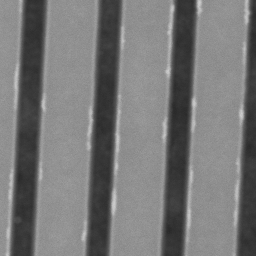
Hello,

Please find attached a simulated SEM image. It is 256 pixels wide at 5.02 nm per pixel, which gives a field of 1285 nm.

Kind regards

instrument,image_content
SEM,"one or a few lines or trenches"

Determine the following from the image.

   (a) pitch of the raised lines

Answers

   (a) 0.377 microns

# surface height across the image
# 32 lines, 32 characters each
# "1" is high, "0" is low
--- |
11100011111100011111110001111110
11100011111100011111110001111110
11100011111100011111110011111110
11100011111100011111110011111110
11100011111100011111110011111110
11100011111100011111110011111110
11100111111100011111110011111110
11100111111100011111100011111110
11100111111100011111100011111110
11000111111100011111100011111110
11000111111100011111100011111110
11000111111100011111100011111110
11000111111100011111100011111110
11000111111100011111100011111110
11000111111100111111100011111110
11000111111100111111100011111100
11000111111100111111100011111100
11000111111000111111100011111100
11000111111000111111100011111100
11000111111000111111100011111100
11000111111000111111100011111100
11000111111000111111100111111100
11000111111000111111100111111100
11000111111000111111100111111100
11000111111000111111100111111100
11001111111000111111100111111100
11001111111000111111100111111100
11001111111000111111000111111100
10001111111000111111000111111100
10001111111000111111000111111100
10001111111000111111000111111100
10001111111000111111000111111100